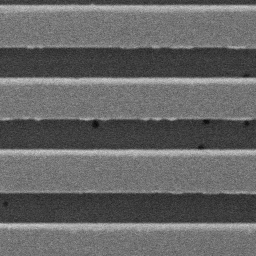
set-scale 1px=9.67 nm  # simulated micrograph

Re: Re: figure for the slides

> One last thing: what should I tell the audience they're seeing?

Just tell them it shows lines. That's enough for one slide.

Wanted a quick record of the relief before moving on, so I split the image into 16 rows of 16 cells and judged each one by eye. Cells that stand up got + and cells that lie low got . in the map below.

...++++.....++++
++++++++++++++++
++++++++++++++++
................
................
++++++++++++++++
++++++++++++++++
................
................
................
++++++++++++++++
++++++++++++++++
................
................
++++++++++++++++
++++++++++++++++